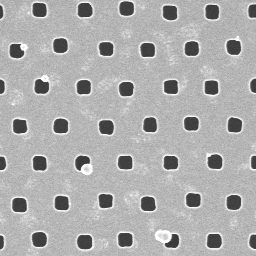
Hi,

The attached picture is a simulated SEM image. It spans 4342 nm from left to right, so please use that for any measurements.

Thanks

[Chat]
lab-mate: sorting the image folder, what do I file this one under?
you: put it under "a regular array of holes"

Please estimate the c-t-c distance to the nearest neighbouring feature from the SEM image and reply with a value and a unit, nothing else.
0.706 µm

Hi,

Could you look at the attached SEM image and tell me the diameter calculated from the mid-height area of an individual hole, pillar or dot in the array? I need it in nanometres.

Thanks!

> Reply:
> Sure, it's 263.